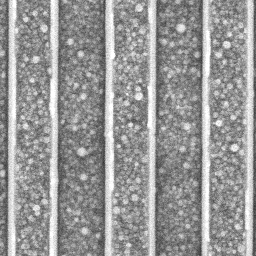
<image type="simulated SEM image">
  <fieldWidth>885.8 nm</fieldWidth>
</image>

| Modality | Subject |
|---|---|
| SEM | one or a few lines or trenches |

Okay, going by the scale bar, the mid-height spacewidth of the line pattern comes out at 178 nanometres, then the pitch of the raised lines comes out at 97.3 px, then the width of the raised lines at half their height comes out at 0.157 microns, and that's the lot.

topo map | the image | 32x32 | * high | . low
.******.......*****.......*****.
.******.......*****.......*****.
.******.......*****.......*****.
.******.......*****.......*****.
.******.......*****.......*****.
.******.......*****.......*****.
.******.......*****.......*****.
.******.......*****.......*****.
.******.......*****.......*****.
.******.......*****.......*****.
.******.......*****.......*****.
.******.......*****.......*****.
.******.......*****.......*****.
.******......******.......*****.
.******......******.......*****.
.******.......*****.......*****.
.******......******.......*****.
.******.......*****.......*****.
.******.......*****.......*****.
.******.......*****.......*****.
.******.......*****.......*****.
.******.......*****.......*****.
.******.......*****.......*****.
.******.......*****.......*****.
.******.......*****.......*****.
.******.......*****.......*****.
.******.......*****.......*****.
.******.......*****.......*****.
.******.......*****.......*****.
.******.......*****.......*****.
.******.......*****.......*****.
.******......******.......*****.